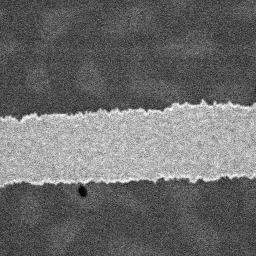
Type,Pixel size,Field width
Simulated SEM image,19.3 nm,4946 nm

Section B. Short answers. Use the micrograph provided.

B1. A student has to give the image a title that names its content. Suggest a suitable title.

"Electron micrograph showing one or a few lines or trenches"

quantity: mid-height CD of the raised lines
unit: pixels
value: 69.9